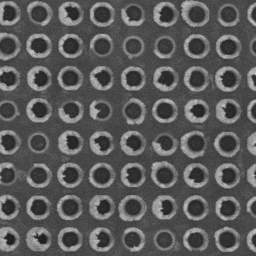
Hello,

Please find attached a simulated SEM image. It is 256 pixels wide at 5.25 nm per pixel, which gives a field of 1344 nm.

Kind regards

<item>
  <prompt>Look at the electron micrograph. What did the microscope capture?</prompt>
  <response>a regular array of holes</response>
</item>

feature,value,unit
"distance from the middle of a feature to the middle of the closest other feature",161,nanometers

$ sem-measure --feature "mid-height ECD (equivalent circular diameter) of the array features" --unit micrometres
0.0871